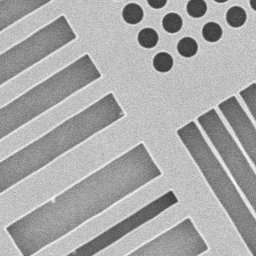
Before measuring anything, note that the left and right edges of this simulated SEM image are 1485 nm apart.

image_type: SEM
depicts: groups of lines, slits or small figures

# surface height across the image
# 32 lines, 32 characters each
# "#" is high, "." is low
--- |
......##########.##..##...#####.
....###########...#####...##...#
..#####.########..##...#####...#
.####....###########...##...####
####.....########...#####...####
##......##########..##...#######
.......#############.#...#######
.....#####.########...##########
....####....#######..###########
..####......####################
#####......####################.
###......#####################..
##......####...#############....
......#####....############...#.
.....####......##########..#....
...#####......#########.....#...
..####......##########..........
#####......############.........
###......########.#####...#.....
#.......#######....#####........
......#######......######.......
....########........#####.......
...#######.........#######......
.########........#########......
#######.........####..#####.....
#####.........####....######....
####.........####...########....
##.........####....####.#####...
#........#####...####...#####...
#.......####....####.....#####..
##....#####...####........#####.
##...####...#####.........#####.